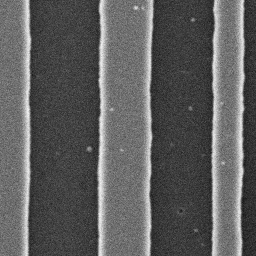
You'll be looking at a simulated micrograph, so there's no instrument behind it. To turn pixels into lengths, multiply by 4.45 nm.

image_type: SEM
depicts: lines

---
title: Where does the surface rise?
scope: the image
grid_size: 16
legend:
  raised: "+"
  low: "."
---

++....++++...++.
++....+++....++.
++....+++....++.
++....+++....++.
++....+++....++.
++....+++....++.
++....+++....++.
++....+++....++.
++....+++....++.
++....+++....++.
++....+++....++.
++....+++....++.
++....+++....++.
++....+++....++.
++....+++....++.
++....+++....++.